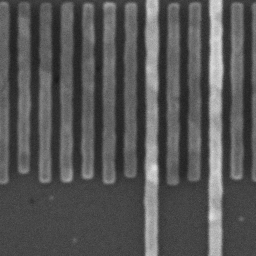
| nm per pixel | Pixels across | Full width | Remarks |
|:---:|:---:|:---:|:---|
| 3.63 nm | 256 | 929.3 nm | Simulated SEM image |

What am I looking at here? groups of lines, slits or small figures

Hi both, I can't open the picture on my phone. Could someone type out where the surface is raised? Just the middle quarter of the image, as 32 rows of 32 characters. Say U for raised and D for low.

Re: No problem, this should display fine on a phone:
UUDDDUUDDDUUUDDUUUDDDUUDDDUUUDDU
UUDDDUUDDDUUUDDUUUDDDUUDDDUUDDDU
UUDDDUUDDDUUDDDUUUDDDUUDDDUUDDDU
UUDDDUUDDDUUUDDUUUDDDUUDDDUUDDDU
UUDDDUUDDDUUUDDUUUDDDUUDDDUUDDDU
UUDDDUUDDDUUUDDUUUDDDUUDDDUUUDDU
UUDDDUUDDDUUUDDUUUDDDUUDDDUUUDDU
UUDDDUUDDDUUUDDUUUDDDUUDDDUUUDDD
UUDDDUUDDDUUUDDUUUDDDUUDDDUUUDDU
UUDDDUUDDDUUUDDUUUDDDUUDDDUUUDDU
UUDDDUUDDDUUUDDUUUDDDUUDDDUUUDDU
UUDDDUUDDDUUDDDUUUDDDUUDDDUUUDDU
UUDDDUUDDDUUDDDUUUDDDUUDDDUUDDDU
UUDDDUUDDDUUUDDUUUDDDUUDDDUUDDDU
UUDDDUUDDDUUUDDUUUDDDUUDDDUUDDDU
UUDDDUUDDDUUUDDUUUDDDUUDDDUUUDDU
UUDDDUUDDDUUUDDUUUDDDUUDDDUUUDDU
UUDDDUUDDDUUUDDUUUDDDUUDDDUUUDDU
UUDDDUUDDDUUUDDUUUDDDUUDDDUUDDDU
UUDDDUUDDDUUUDDUUUDDDUUDDDUUDDDU
UUDDDUUDDDUUUDDUUUDDDUUDDDUUDDDU
UUDDDUUDDDUUUDDUUUDDDUUDDDUUDDDU
UUDDDUUDDDUUUDDUUUDDDUUDDDUUDDDU
UUDDDUUDDDUUUDDUUUDDDUUDDDUUDDDU
UUDDDUUDDDUUDDDUUUDDDUUDDDUUDDDU
UUDDDUUDDDUUDDDUUUDDUUUDDDUUDDDU
UUDDDUUDDDUUUDDUUUDDUUUDDDUUDDDU
UUDDDUUDDDUUUDDUUUDDDUUDDDUUDDDU
UUDDDDDDDDUUUDDDDDDDDUUDDDUUDDDU
DDDDDDDDDDUUDDDDDDDDDUUDDDUUDDDD
DDDDDDDDDDDDDDDDDDDDUUUDDDDDDDDD
DDDDDDDDDDDDDDDDDDDDDUUDDDDDDDDD